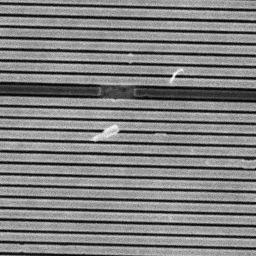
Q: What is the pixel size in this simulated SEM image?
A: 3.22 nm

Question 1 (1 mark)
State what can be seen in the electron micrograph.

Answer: parallel lines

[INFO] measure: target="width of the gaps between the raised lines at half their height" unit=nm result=10.9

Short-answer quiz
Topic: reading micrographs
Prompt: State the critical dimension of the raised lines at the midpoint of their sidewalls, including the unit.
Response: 24.5 nm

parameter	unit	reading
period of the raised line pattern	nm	36.5